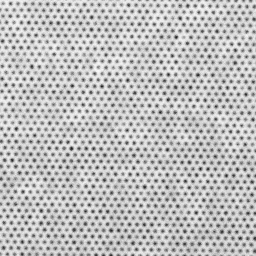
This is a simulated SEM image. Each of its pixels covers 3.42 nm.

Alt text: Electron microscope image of a regular array of holes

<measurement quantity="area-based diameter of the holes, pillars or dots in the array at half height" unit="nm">10.2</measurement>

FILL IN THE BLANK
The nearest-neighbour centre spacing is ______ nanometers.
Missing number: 24